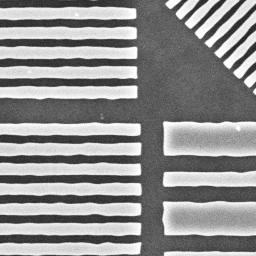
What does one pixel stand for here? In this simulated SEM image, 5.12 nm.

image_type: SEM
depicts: groups of lines, slits or small figures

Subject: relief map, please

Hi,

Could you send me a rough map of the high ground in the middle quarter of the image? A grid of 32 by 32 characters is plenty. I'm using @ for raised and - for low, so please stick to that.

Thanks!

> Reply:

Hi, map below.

--------------------------------
@@@@@@@@@@@@@@@@@@--------------
@@@@@@@@@@@@@@@@@@--------------
@@@---@@------@@----------------
--------------------------------
--------------------------------
@@@@@@@@@@@@@@@@@@--------------
@@@@@@@@@@@@@@@@@@--------------
@@@@-@@@@-@@@@------------------
--------------------------------
--------------------------------
--------------------------------
--------------------------------
--------------------------------
--------------------------------
@@@@@@@@@@@@@@@@@@@------@@@@@@@
@@@@@@@@@@@@@@@@@@@------@@@@@@@
@@@@@@@@@@@@@@@@@@@------@@@@@@@
-------------------------@@@@@@@
-------------------------@@@@@@@
@@@@@@@@@@@@@@@@@@@------@@@@@@@
@@@@@@@@@@@@@@@@@@@------@@@@@@@
@@@-@@@@@@@@@@@@@@@------@@@@@-@
--------------------------------
--------------------------------
@@@@@@@@@@@@@@@@@@@-------------
@@@@@@@@@@@@@@@@@@@-------------
@@@@@@@@@@@@@@@@@@@------@@@@@@@
-------------------------@@@@@@@
-------------------------@@@@@@@
@@@@@@@@@@@@@@@@@@@-------@-----
@@@@@@@@@@@@@@@@@@@-------------